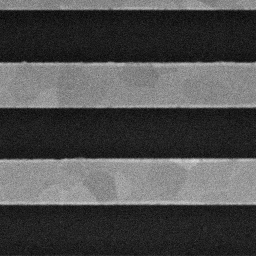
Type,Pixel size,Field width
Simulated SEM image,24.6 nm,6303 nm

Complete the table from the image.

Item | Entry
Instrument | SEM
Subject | lines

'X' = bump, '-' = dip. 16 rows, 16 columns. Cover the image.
XXXXXXXXXXXXXXXX
----------------
----------------
----------------
XXXXXXXXXXXXXXXX
XXXXXXXXXXXXXXXX
XXXXXXXXXXXXXXXX
----------------
----------------
----------------
XXXXXXXXXXXXXXXX
XXXXXXXXXXXXXXXX
XXXXXXXXXXXXXXXX
----------------
----------------
----------------